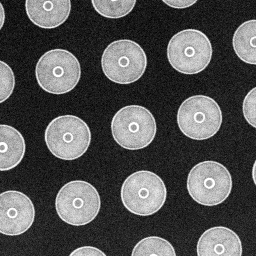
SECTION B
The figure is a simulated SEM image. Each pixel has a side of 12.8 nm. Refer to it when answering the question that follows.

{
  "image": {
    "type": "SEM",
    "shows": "an array of small figures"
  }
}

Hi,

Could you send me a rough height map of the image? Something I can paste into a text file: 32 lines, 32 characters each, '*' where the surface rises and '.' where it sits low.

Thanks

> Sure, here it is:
***......***.....****...********
***......***....****************
****....************************
******************************..
**********************....***...
**************...****.....***..*
******..*****.....***..*..****..
*****.....***..*..***.....****..
.****.....***.....****...*******
..***.....***....***************
..***....***********************
.*****..***********************.
***********************...*****.
****************..*****....***..
**************.....***..*...***.
******.....***.....***......***.
..****.....***.....****....*****
...***..*..****....*************
*..***.....*****.***************
...****...**********************
..***********************..*****
************************....****
****************....****.....***
********....***......***.....***
...****.....***......***....****
....***..*..****....******.*****
.*..***.....*****..*************
....****...*********************
...************************.****
*************************.....**
*****************....****.....**
*********....****.....***..*..**